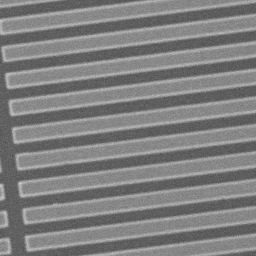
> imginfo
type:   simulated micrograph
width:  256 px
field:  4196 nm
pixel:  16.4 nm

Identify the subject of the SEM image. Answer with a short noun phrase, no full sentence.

parallel lines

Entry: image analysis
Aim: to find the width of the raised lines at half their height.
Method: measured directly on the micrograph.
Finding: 222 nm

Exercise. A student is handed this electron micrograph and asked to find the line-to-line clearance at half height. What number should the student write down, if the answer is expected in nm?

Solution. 224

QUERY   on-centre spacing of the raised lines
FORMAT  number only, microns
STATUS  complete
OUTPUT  0.447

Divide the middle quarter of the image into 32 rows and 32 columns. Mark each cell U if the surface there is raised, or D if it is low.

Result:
DDDUUUUUUUUUUUUUUUUUUUUUUUUUUDDD
UUUUUUUUUUUUUUUUUUUUUDDDDDDDDDDD
UUUUUUUUUUUDDDDDDDDDDDDDDDDDDDDD
UUUUUDDDDDDDDDDDDDDDDDDDDDDDDDDD
DDDDDDDDDDDDDDDDDDDDDDDDDDUUUUUU
DDDDDDDDDDDDDDDDDDUUUUUUUUUUUUUU
DDDDDDDDDDUUUUUUUUUUUUUUUUUUUUUU
DDUUUUUUUUUUUUUUUUUUUUUUUUUUDDDD
UUUUUUUUUUUUUUUUUUUDDDDDDDDDDDDD
UUUUUUUUUUUUDDDDDDDDDDDDDDDDDDDD
UUUUDDDDDDDDDDDDDDDDDDDDDDDDDDDD
DDDDDDDDDDDDDDDDDDDDDDDDUUUUUUUU
DDDDDDDDDDDDDDDDDUUUUUUUUUUUUUUU
DDDDDDDDDUUUUUUUUUUUUUUUUUUUUUUU
DUUUUUUUUUUUUUUUUUUUUUUUUUUDDDDD
UUUUUUUUUUUUUUUUUUUDDDDDDDDDDDDD
UUUUUUUUUUUDDDDDDDDDDDDDDDDDDDDD
UUUDDDDDDDDDDDDDDDDDDDDDDDDDDDDU
DDDDDDDDDDDDDDDDDDDDDDDUUUUUUUUU
DDDDDDDDDDDDDDDUUUUUUUUUUUUUUUUU
DDDDDDDDUUUUUUUUUUUUUUUUUUUUUUUU
UUUUUUUUUUUUUUUUUUUUUUUUUDDDDDDD
UUUUUUUUUUUUUUUUUDDDDDDDDDDDDDDD
UUUUUUUUUUDDDDDDDDDDDDDDDDDDDDDD
UUDDDDDDDDDDDDDDDDDDDDDDDDDDDDUU
DDDDDDDDDDDDDDDDDDDDDDUUUUUUUUUU
DDDDDDDDDDDDDDUUUUUUUUUUUUUUUUUU
DDDDDDUUUUUUUUUUUUUUUUUUUUUUUUUU
UUUUUUUUUUUUUUUUUUUUUUUUDDDDDDDD
UUUUUUUUUUUUUUUUDDDDDDDDDDDDDDDD
UUUUUUUUDDDDDDDDDDDDDDDDDDDDDDDD
UDDDDDDDDDDDDDDDDDDDDDDDDDDDDUUU